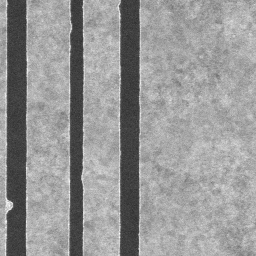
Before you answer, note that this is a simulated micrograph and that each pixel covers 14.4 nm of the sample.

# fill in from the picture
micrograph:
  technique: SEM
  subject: parallel lines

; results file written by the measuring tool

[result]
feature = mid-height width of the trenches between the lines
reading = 0.29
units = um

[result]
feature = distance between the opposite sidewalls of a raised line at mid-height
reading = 570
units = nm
